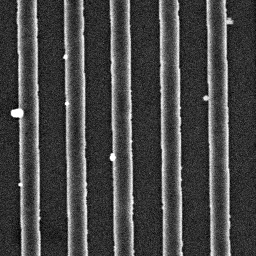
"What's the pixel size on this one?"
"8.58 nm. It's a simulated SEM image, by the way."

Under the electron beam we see lines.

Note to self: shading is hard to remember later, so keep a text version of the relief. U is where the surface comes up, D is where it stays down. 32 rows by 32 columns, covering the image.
DDUUDDDDUUDDDDUUDDDDUUDDDDUUDDDD
DDUUDDDDUUDDDDUUDDDDUUDDDDUUDDDD
DDUUUDDDUUDDDDUUDDDDUUDDDDUUUDDD
DDUUUDDDUUDDDDUUDDDDUUDDDDUUDDDD
DDUUUDDDUUDDDDUUDDDDUUDDDDUUDDDD
DDUUUDDDUUDDDDUUDDDDUUDDDDUUDDDD
DDUUUDDDUUDDDDUUDDDDUUDDDDUUDDDD
DDUUUDDDUUDDDDUUDDDDUUDDDDUUDDDD
DDUUUDDDUUDDDDUUDDDDUUDDDDUUDDDD
DDUUUDDDUUUDDDUUDDDDUUDDDDUUDDDD
DDUUUDDDUUUDDDUUDDDDUUDDDDUUDDDD
DDUUUDDDUUUDDDUUDDDDUUDDDDUUDDDD
DDUUUDDDUUUDDDUUDDDDUUDDDDUUDDDD
DDUUUDDDUUUDDDUUDDDDUUUDDDUUDDDD
DDUUUDDDUUUDDDUUDDDDUUUDDDUUDDDD
DDUUUDDDUUUDDDUUDDDDUUUDDDUUDDDD
DDDUUDDDUUUDDDUUDDDDUUUDDDUUDDDD
DDDUUDDDUUUDDDUUDDDDUUUDDDUUDDDD
DDDUUDDDUUUDDDUUDDDDUUUDDDUUDDDD
DDDUUDDDUUUDDDUUDDDDUUUDDDUUDDDD
DDDUUDDDUUUDDDUUDDDDUUUDDDUUDDDD
DDDUUDDDUUUDDDUUDDDDUUUDDDUUUDDD
DDDUUDDDUUUDDDUUDDDDUUUDDDUUUDDD
DDDUUDDDUUUDDDUUDDDDUUUDDDUUUDDD
DDDUUDDDUUUDDDUUUDDDUUUDDDUUUDDD
DDDUUDDDUUUDDDUUUDDDUUUDDDUUUDDD
DDDUUDDDUUUDDDUUUDDDUUUDDDUUUDDD
DDDUUDDDDUUDDDUUUDDDUUUDDDUUUDDD
DDDUUDDDDUUDDDUUUDDDUUUDDDUUUDDD
DDDUUDDDDUUDDDUUUDDDUUUDDDUUUDDD
DDDUUDDDDUUDDDUUUDDDUUUDDDUUUDDD
DDDUUDDDDUUDDDUUUDDDUUUDDDUUUDDD